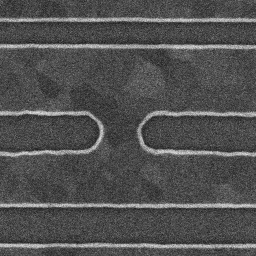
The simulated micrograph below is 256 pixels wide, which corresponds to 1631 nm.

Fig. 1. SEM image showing one or a few lines or trenches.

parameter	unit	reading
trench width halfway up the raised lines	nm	249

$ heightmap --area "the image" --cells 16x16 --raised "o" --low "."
oooooooooooooooo
................
................
oooooooooooooooo
oooooooooooooooo
oooooooooooooooo
oooooooooooooooo
......ooo.......
......ooo.......
.....oooooo.....
oooooooooooooooo
oooooooooooooooo
oooooooooooooooo
................
................
oooooooooooooooo